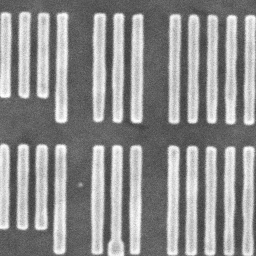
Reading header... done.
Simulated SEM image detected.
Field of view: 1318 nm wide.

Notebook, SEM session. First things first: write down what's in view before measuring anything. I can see wiring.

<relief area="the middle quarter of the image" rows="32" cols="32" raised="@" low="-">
@-------@@--@@@--@@-------@@@--@
@-------@@--@@@--@@-------@@@--@
@-------@@--@@@--@@-------@@@--@
@-------@@--@@@--@@-------@@@--@
@-------@@--@@@--@@-------@@@--@
@-------@@--@@@--@@-------@@@--@
@-------@@--@@@--@@-------@@@--@
@-------@@--@@@--@@-------@@@--@
@-------@@--@@@--@@-------@@@--@
@-------@@--@@@--@@-------@@@--@
@-------@@--@@@--@@-------@@@--@
@-------@@--@@@--@@-------@@@--@
@-------@@--@@@--@@-------@@@--@
@-------@@--@@---@@-------@@@--@
-------------@---@@--------@@--@
--------------------------------
--------------------------------
--------------------------------
--------------------------------
--------------------------------
--------------------------------
--------@@--@@---@@-------@@@--@
--------@@--@@---@@-------@@@--@
--------@@--@@---@@-------@@@--@
-------@@@--@@---@@-------@@@--@
-------@@@--@@---@@-------@@@--@
-------@@@--@@---@@-------@@@--@
-------@@@--@@---@@-------@@@--@
-------@@@--@@---@@-------@@@--@
-------@@@--@@---@@-------@@@--@
-------@@@--@@---@@-------@@@--@
-------@@@--@@---@@-------@@@--@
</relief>